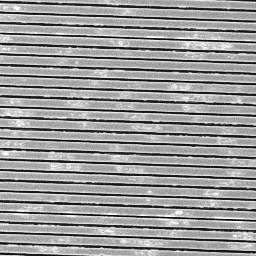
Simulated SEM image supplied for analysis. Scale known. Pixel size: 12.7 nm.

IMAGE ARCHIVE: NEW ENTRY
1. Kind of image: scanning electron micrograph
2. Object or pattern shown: parallel lines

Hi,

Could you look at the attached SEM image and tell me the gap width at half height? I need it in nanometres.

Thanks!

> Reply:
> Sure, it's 34.8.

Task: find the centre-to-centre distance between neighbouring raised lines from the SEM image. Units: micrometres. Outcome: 0.133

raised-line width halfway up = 8.25 px